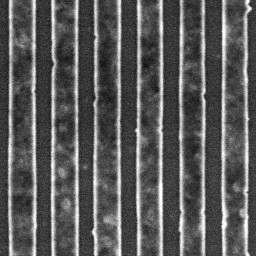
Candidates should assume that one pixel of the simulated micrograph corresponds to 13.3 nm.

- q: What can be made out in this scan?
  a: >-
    parallel lines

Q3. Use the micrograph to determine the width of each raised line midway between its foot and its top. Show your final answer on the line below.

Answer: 340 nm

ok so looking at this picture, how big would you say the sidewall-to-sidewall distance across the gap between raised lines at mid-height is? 0.238 um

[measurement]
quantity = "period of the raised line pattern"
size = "566 nm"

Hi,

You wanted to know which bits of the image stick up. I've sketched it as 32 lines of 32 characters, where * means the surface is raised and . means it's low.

.***...***..***..***...**...***.
.***...***..***..***...**...***.
.***...***..***..***...**...***.
.***...***..***..***...**...***.
.***...***..***..***...**...***.
.***...***..***..***...**...***.
.***...***..***..***...**...***.
.***...***..***..***...**...***.
.***...***..***..***...**...***.
.***...***..***..***...**...***.
.***...***..***..***...**...***.
.***...***..***..***...**...***.
.***...***..***..***...**...***.
.***...***..***..***...**...***.
.***...***..***..***...**...***.
.***...***..***..***...**...***.
.***...***..***..***...**...***.
.***...***..***..***...**...***.
.***...***..***..***...**...***.
.***...***..***..***...**...***.
.***...***..***..***...**...***.
.***...***..***..***...**...***.
.***...***..***..***...**...***.
.***...***..***..***...**...***.
.***...***..***..***...**...***.
.***...***..***..***...**...***.
.***...***..***..***...**...***.
.***...***..***..***...**...***.
.***...***..***..***...**...***.
.***...***..***..***...**...***.
.***...***..***..***...**...***.
.***...***..***..***...**...***.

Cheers